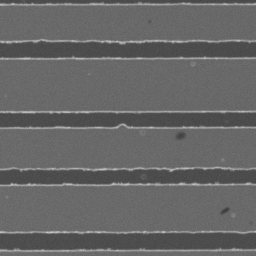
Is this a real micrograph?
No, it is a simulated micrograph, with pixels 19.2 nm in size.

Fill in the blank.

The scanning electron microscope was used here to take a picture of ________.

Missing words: one or a few lines or trenches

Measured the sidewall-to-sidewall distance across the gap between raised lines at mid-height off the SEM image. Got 860 nanometres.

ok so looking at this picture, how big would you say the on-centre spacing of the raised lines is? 1.22 micrometres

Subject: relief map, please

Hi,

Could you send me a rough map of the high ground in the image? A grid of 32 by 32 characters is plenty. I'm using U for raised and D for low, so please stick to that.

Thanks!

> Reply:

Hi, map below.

UUUUUUUUUUUUUUUUUUUUUUDUUUUUUUUU
DDDDDDDDDDDDDDDDDDDDDDDDDDDDDDDD
DDDDDDDDDDDDDDDDDDDDDDDDDDDDDDDD
DDDDDDDDDDDDDDDDDDDDDDDDDDDDDDDD
DDDDDDDDDDDDDDDDDDDDDDDDDDDDDDDD
UUUUUUUUUUUUUUUUUUUUUUUUUUUUUUUU
UUUUUUUUUUUUUUUUUUUUUUUUUUUUUUUU
DDDDDDDDDDDDDDDDDDDDDDDDDDDDDDDD
DDDDDDDDDDDDDDDDDDDDDDDDDDDDDDDD
DDDDDDDDDDDDDDDDDDDDDDDDDDDDDDDD
DDDDDDDDDDDDDDDDDDDDDDDDDDDDDDDD
DDDDDDDDDDDDDDDDDDDDDDDDDDDDDDDD
DDDDDDDDDDDDDDDDDDDDDDDDDDDDDDDD
DDDDDDDDDDDDDDDDDDDDDDDDDDDDDDDD
UUUUUUUUUUUUUUUUUUUUUUUUUUUUUUUU
UUUUUUUUUUUUUUUUUUUUUUUUUUUUUUUU
DDDDDDDDDDDDDDDDDDDDDDDDDDDDDDDD
DDDDDDDDDDDDDDDDDDDDDDDDDDDDDDDD
DDDDDDDDDDDDDDDDDDDDDDDDDDDDDDDD
DDDDDDDDDDDDDDDDDDDDDDDDDDDDDDDD
DDDDDDDDDDDDDDDDDDDDDDDDDDDDDDDD
UUUUUUUUUUUUUUUUUUUUUUUUUUUUUUUU
UUUUUUUUUUUUUUUUUUUUUUUUUUUUUUUU
DDDDDDDDDDDDDDDDDDDDDDDDDDDDDDDD
DDDDDDDDDDDDDDDDDDDDDDDDDDDDDDDD
DDDDDDDDDDDDDDDDDDDDDDDDDDDDDDDD
DDDDDDDDDDDDDDDDDDDDDDDDDDDDDDDD
DDDDDDDDDDDDDDDDDDDDDDDDDDDDDDDD
DDDDDDDDDDDDDDDDDDDDDDDDDDDDDDDD
UUUUUUUUUUUUUUUUUUUUUUUUUUUUUUUU
UUUUUUUUUUUUUUUUUUUUUUUUUUUUUUUU
DDDDDDDDDDDDDDDDDDDDDDDDDDDDDDDD